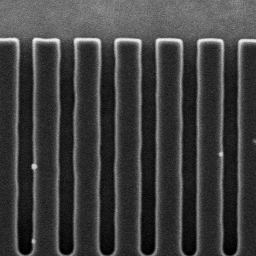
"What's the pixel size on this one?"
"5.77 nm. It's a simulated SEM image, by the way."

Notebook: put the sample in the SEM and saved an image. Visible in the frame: groups of lines, slits or small figures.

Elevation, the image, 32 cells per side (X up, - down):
--------------------------------
--------------------------------
--------------------------------
--------------------------------
--------------------------------
XX--XXX--XXXX-XXXX--XXX--XXX--XX
XX--XXX--XXXX-XXX---XXX--XXX--XX
XX--XXX--XXXX--XX---XXX--XXX--XX
XX--XXX--XXXX--XXX--XXX--XXX--XX
XX--XXX--XXXX-XXXX--XXX--XXX--XX
XX--XXX--XXX--XXXX--XXX--XXX--XX
XX--XXX--XXX---XXX--XXX--XXX--XX
XX--XXX--XXX---XXX--XXX--XXX--XX
XX--XXX--XXX---XXX--XXX--XXX--XX
XX--XXX--XXX---XXX--XXX--XXX--XX
XX--XXX--XXX---XXX--XXX--XXX--XX
XX--XXX--XXX---XXX--XXX--XXX--XX
XX--XXX--XXX---XXX--XXX--XXX--XX
XX--XXX--XXX---XXX--XXX--XXX--XX
XX--XXX--XXX---XX---XXX--XXX--XX
XX--XXX--XXXX-XXX---XXX--XXX--XX
XX--XXX--XXX--XXXX--XXX--XXX--XX
XX--XXX--XXX--XXXX--XXX--XXX--XX
XX--XXX--XXX--XXXX--XXX--XXX--XX
XX--XXX--XXX---XXX--XXX--XXX--XX
XX--XXX--XXX---XXX--XXX--XXX--XX
XX--XXX--XXX--XXXX-XXXX--XXX--XX
XX--XXX--XXX--XXX--XXXX--XXX--XX
XX--XXX--XXX--XXX--XXXX--XXX--XX
XX--XXX--XXX--XXX--XXXX--XXX--XX
XX--XXX--XXX--XXX--XXXX--XXX--XX
XX--XXXX-XXXX-XXXX-XXXX-XXXX-XXX